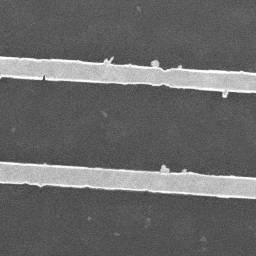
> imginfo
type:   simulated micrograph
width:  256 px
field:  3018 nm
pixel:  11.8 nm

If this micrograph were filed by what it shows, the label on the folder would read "one or a few lines or trenches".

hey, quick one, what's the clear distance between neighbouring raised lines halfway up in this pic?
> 1030 nanometres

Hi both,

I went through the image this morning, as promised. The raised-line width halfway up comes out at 0.224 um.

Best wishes